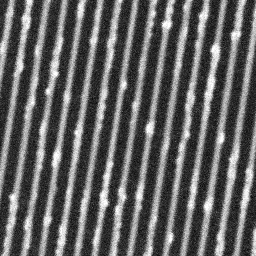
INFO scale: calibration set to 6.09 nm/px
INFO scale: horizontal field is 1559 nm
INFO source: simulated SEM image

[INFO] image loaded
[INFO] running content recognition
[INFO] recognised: parallel lines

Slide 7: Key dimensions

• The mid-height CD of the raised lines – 0.0285 micrometres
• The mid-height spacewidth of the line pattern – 79.6 nanometers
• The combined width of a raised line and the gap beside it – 106 nanometres